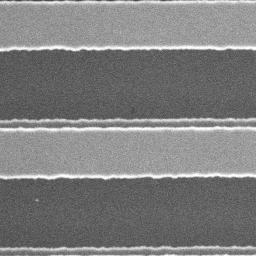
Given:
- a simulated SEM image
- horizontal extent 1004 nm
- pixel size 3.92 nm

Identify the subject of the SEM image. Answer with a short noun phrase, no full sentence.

lines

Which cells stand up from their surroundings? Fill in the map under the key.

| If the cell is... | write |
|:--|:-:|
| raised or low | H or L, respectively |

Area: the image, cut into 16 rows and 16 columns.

HHHHHHHHHHHHHHHH
HHHHHHHHHHHHHHHH
HHHHHHHHHHHHHHHH
LLLLLLLLLLLLLLLL
LLLLLLLLLLLLLLLL
LLLLLLLLLLLLLLLL
LLLLLLLLLLLLLLLL
LLLLLLLLLLLLLLLL
HHHHHHHHHHHHHHHH
HHHHHHHHHHHHHHHH
HHHHHHHHHHHHHHHH
LLLLLLLLLLLLLLLL
LLLLLLLLLLLLLLLL
LLLLLLLLLLLLLLLL
LLLLLLLLLLLLLLLL
LLLLLLLLLLLLLLLL